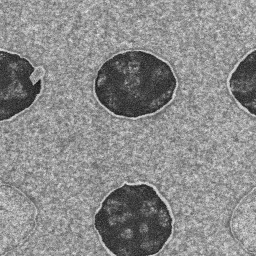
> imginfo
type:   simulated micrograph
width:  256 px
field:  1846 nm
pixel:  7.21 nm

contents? holes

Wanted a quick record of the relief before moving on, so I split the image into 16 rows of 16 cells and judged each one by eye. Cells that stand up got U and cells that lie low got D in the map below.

UUUUUUUUUUUUUUUU
UUUUUUUUUUUUUUUU
UUUUUUUUUUUUUUUU
DUUUUUUDDDUUUUUD
DDUUUUDDDDDUUUUD
DDDUUUDDDDDUUUDD
DDUUUUDDDDUUUUUD
UUUUUUUUUUUUUUUU
UUUUUUUUUUUUUUUU
UUUUUUUUUUUUUUUU
UUUUUUUUUUUUUUUU
UUUUUUUUUUUUUUUU
DDUUUUDDDDUUUUUD
DDUUUUDDDDDUUUUD
DDUUUUDDDDDUUUUD
DUUUUUUDDDUUUUUD